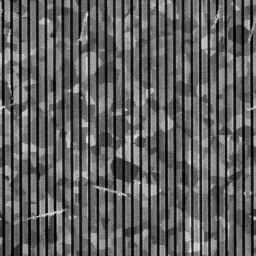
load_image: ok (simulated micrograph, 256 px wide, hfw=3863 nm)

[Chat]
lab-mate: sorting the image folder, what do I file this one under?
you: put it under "parallel lines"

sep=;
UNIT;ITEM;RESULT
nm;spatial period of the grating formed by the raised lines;129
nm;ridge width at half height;84.9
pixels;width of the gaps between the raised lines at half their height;2.88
